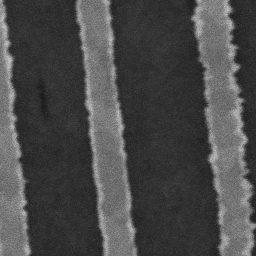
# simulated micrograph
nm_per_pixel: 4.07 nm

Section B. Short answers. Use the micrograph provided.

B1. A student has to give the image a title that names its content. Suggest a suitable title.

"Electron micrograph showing one or a few lines or trenches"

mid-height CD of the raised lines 120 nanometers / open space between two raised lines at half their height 330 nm